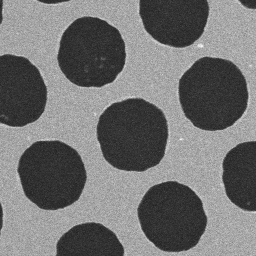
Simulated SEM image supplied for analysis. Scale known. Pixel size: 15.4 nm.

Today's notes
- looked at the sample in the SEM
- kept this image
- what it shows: holes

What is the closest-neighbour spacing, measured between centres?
1390 nm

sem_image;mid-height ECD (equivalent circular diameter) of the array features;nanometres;1080